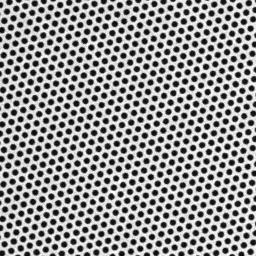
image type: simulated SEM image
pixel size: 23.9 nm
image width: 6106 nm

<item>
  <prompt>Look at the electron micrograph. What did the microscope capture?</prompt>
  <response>a regular array of holes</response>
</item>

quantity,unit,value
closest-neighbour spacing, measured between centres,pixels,9.3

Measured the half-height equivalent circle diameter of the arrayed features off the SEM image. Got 0.17 µm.